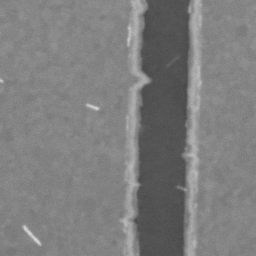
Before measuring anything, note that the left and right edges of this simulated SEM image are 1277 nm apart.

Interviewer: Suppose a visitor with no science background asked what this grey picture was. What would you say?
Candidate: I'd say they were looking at one or a few lines or trenches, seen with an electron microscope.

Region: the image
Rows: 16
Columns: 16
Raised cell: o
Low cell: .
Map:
ooooooooo...oooo
ooooooooo...oooo
oooooooo....oooo
oooooooo....oooo
ooooooooo...oooo
ooooooooo...oooo
oooooooo....oooo
oooooooo....oooo
oooooooo....oooo
oooooooo....oooo
oooooooo....oooo
oooooooo....oooo
oooooooo....oooo
oooooooo....oooo
oooooooo....oooo
oooooooo....oooo